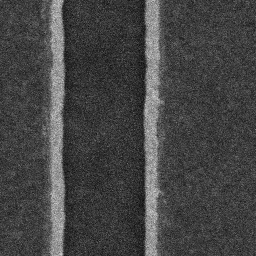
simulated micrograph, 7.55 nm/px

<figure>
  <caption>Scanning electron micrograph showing one or a few lines or trenches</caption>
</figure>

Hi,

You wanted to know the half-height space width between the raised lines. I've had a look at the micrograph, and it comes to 726 nanometres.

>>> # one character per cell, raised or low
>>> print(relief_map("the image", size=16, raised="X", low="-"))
XXX-------XXXXXX
XXXX------XXXXXX
XXXX------XXXXXX
XXXX------XXXXXX
XXXX------XXXXXX
XXXX------XXXXXX
XXX-------XXXXXX
XXX------XXXXXXX
XXX-------XXXXXX
XXX-------XXXXXX
XXX-------XXXXXX
XXXX------XXXXXX
XXXX------XXXXXX
XXXX------XXXXXX
XXXX------XXXXXX
XXX-------XXXXXX